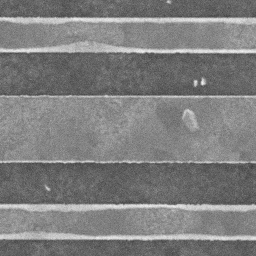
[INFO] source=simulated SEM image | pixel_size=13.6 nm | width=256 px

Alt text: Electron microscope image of lines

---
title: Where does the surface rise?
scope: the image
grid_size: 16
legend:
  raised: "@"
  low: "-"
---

----------------
@@@@@@@@@@@@@@@@
@@@@@@@@@@@@@@@@
----------------
----------------
----------------
@@@@@@@@@@@@@@@@
@@@@@@@@@@@@@@@@
@@@@@@@@@@@@@@@@
@@@@@@@@@@@@@@@@
----------------
----------------
----------------
@@@@@@@@@@@@@@@@
@@@@@@@@@@@@@@@@
----------------